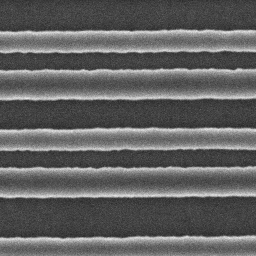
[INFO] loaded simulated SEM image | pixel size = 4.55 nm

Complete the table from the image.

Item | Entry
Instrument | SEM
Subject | lines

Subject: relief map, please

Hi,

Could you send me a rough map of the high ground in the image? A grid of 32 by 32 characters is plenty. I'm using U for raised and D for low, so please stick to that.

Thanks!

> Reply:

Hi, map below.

DDDDDDDDDDDDDDDDDDDDDDDDDDDDDDDD
DDDDDDDDDDDDDDDDDDDDDDDDDDDDDDDD
DDDDDDDDDDDDDDDDDDDDDDDDDDDDDDDD
DDDDDDDDDDDDDDDDDDDDDDDDDDDDDDDD
UUUUUUUUUUUUUUUUUUUUUUUUUUUUUUUU
UUUUUUUUUUUUUUUUUUUUUUUUUUUUUUUU
UUUUUUUUUUUUUUUUUUUUDUDDDDUDDDDD
DDDDDDDDDDDDDDDDDDDDDDDDDDDDDDDD
DDDDDDDDDDDDDDDDDDDDDDDDDDDDDDDD
UUUUUUUUUUUUUUUUUUUUUUUUUUUUUUUU
UUUUUUUUUUUUUUUUUUUUUUUUUUUUUUUU
UUUUUUUUUUUUUUUUUUUUUUUUUUUUUUUU
DDDDDDDDDDDDDDDDDDDDDDDDDDDDDDDD
DDDDDDDDDDDDDDDDDDDDDDDDDDDDDDDD
DDDDDDDDDDDDDDDDDDDDDDDDDDDDDDDD
DDDDDDDDDDDDDDDDDDDDDDDDDDDDDDDD
UUUUUUUUUUUUUUUUUUUUUUUUUUUUUUUU
UUUUUUUUUUUUUUUUUUUUUUUUUUUUUUUU
UUUUUUUUUUUUUUUUUUUUUUUUUUUUUUUU
DDDDDDDDDDDDDDDDDDDDDDDDDDDDDDDD
DDDDDDDDDDDDDDDDDDDDDDDDDDDDDDDD
UUUUUUUUUUUUUUUUUUUUUUUUUUUUUUUU
UUUUUUUUUUUUUUUUUUUUUUUUUUUUUUUU
UUUUUUUUUUUUUUUUUUUUUUUUUUUUUUUU
UUUUUUUUUUUUUUUDUDDDDDDDDDDDDDDD
DDDDDDDDDDDDDDDDDDDDDDDDDDDDDDDD
DDDDDDDDDDDDDDDDDDDDDDDDDDDDDDDD
DDDDDDDDDDDDDDDDDDDDDDDDDDDDDDDD
DDDDDDDDDDDDDDDDDDDDDDDDDDDDDDDD
DDDDDDDDDDDDDDDDDDDDDDDDDDDDDDDD
UUUUUUUUUUUUUUUUUUUUUUUUUUUUUUUU
UUUUUUUUUUUUUUUUUUUUUUUUUUUUUUUU